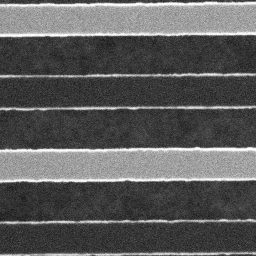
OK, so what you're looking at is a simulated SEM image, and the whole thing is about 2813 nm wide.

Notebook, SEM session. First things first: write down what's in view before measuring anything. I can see lines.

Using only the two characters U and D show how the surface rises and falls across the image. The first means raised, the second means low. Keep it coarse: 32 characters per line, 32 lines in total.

DDDDDDDDDDDDDDDDDDDDDDDDDUUUUUUU
UUUUUUUUUUUUUUUUUUUUUUUUUUUUUUUU
UUUUUUUUUUUUUUUUUUUUUUUUUUUUUUUU
UUUUUUUUUUUUUUUUUUUUUUUUUUUUUUUU
DDDDDDDDDDDDDDDDDDDDDDDDDDDDDDDD
DDDDDDDDDDDDDDDDDDDDDDDDDDDDDDDD
DDDDDDDDDDDDDDDDDDDDDDDDDDDDDDDD
DDDDDDDDDDDDDDDDDDDDDDDDDDDDDDDD
DDDDDDDDDDDDDDDDDDDDDDDDDDDDDDDD
DDDDDDDDDDDUUUUUUUUUUUUUUUUUUUUU
UUUUUUUUUUUUUUUUUUUUUUUUUUUUUUUU
UUUUUUUUUUUUUUUUUUUUUUUUUUUUUUUU
UUUUUUUUUUUUUUUUUUUUUUUUUUUUUUUU
UUUUUUUUUUUUUUUDUUDDDDDDDDDDDDDD
DDDDDDDDDDDDDDDDDDDDDDDDDDDDDDDD
DDDDDDDDDDDDDDDDDDDDDDDDDDDDDDDD
DDDDDDDDDDDDDDDDDDDDDDDDDDDDDDDD
DDDDDDDDDDDDDDDDDDDDDDDDDDDDDDDD
DDDDDDDDDDDDDDDDDDDDDDDDDDDDDDDD
UUUUUUUUUUUUUUUUUUUUUUUUUUUUUUUU
UUUUUUUUUUUUUUUUUUUUUUUUUUUUUUUU
UUUUUUUUUUUUUUUUUUUUUUUUUUUUUUUU
UUUUUUUUUUUUUUUDDUDDDDDDDDDDDDDD
DDDDDDDDDDDDDDDDDDDDDDDDDDDDDDDD
DDDDDDDDDDDDDDDDDDDDDDDDDDDDDDDD
DDDDDDDDDDDDDDDDDDDDDDDDDDDDDDDD
DDDDDDDDDDDDDDDDDDDDDDDDDDDDDDDD
DDDDDDDDDDDDDDDDDDDDDDDDDDDDDDDD
UUUUUUUUUUUUUUUUUUUUUUUUUUUUUUUU
UUUUUUUUUUUUUUUUUUUUUUUUUUUUUUUU
UUUUUUUUUUUUUUUUUUUUUUUUUUUUUUUU
UUUUUUUUUUUUUUUUUUUUUUUUUUUUUUUU